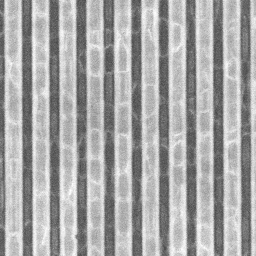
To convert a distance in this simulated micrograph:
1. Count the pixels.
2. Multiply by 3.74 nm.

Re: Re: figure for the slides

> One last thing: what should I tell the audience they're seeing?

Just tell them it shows parallel lines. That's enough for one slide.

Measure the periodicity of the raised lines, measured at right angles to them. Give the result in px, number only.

27.3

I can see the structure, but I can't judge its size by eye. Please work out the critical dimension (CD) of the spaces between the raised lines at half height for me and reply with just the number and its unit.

48.6 nm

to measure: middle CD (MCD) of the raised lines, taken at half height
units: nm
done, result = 52.3